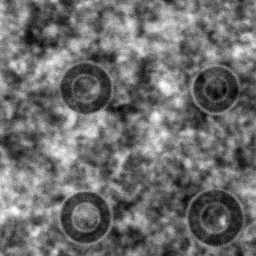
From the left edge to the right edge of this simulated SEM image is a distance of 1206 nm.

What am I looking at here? ring-shaped raised bodies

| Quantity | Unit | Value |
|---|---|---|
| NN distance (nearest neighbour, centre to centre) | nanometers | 606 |